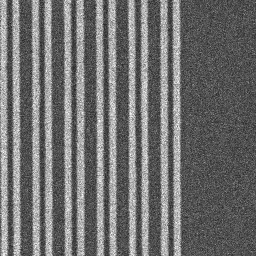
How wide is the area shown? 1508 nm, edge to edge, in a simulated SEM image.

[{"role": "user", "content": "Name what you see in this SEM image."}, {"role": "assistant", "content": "parallel lines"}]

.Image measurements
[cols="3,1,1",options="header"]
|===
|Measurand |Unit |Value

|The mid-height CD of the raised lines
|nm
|34.6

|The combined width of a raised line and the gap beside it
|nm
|92.9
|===